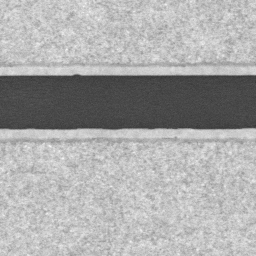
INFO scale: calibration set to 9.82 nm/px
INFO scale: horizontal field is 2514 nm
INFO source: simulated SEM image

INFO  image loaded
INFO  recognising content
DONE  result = one or a few lines or trenches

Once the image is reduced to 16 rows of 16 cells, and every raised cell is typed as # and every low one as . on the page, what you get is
################
################
################
################
................
................
................
................
################
################
################
################
################
################
################
################